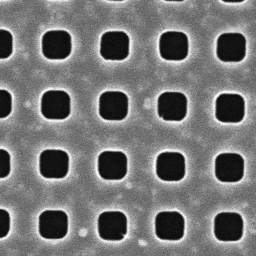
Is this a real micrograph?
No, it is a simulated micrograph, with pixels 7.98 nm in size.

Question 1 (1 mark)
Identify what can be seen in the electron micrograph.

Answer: a regular array of holes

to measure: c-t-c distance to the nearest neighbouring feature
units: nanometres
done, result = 462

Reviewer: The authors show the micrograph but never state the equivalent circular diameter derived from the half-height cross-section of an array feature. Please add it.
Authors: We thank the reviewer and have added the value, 247 nanometers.